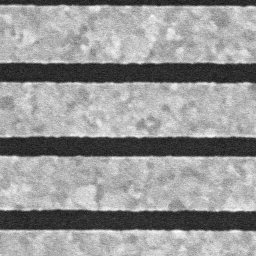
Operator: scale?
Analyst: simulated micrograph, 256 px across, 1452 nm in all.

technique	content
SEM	lines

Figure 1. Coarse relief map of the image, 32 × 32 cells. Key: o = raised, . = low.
................................
oooooooooooooooooooooooooooooooo
oooooooooooooooooooooooooooooooo
oooooooooooooooooooooooooooooooo
oooooooooooooooooooooooooooooooo
oooooooooooooooooooooooooooooooo
oooooooooooooooooooooooooooooooo
oooooooooooooooooooooooooooooooo
................................
................................
ooooooo.ooo..o..ooo.o...ooo...o.
oooooooooooooooooooooooooooooooo
oooooooooooooooooooooooooooooooo
oooooooooooooooooooooooooooooooo
oooooooooooooooooooooooooooooooo
oooooooooooooooooooooooooooooooo
oooooooooooooooooooooooooooooooo
................................
................................
................................
oooooooooooooooooooooooooooooooo
oooooooooooooooooooooooooooooooo
oooooooooooooooooooooooooooooooo
oooooooooooooooooooooooooooooooo
oooooooooooooooooooooooooooooooo
oooooooooooooooooooooooooooooooo
................................
................................
................................
oooooooooooooooooooooooooooooooo
oooooooooooooooooooooooooooooooo
oooooooooooooooooooooooooooooooo